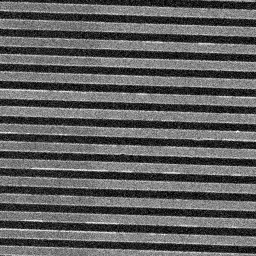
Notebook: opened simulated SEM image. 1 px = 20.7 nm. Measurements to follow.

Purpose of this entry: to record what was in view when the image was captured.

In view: parallel lines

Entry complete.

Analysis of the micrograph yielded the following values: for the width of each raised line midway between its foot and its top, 189 nanometres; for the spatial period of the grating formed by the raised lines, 0.361 microns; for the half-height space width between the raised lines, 168 nm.